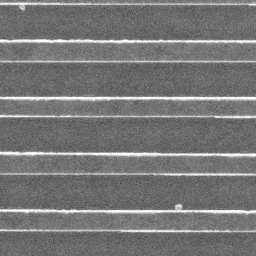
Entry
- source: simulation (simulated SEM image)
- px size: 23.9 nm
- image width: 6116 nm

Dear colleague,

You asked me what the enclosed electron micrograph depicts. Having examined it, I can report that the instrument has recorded lines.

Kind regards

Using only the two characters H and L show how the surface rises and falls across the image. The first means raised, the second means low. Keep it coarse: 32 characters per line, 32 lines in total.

LLLLLLLLLLLLLLLLLLLLLLLLLLLLLLLH
LLLLLLLLLLLLLLLLLLLLLLLLLLLLLLLL
LLLLLLLLLLLLLLLLLLLLLLLLLLLLLLLL
LLLLLLLLLLLLLLLLLLLLLLLLLLLLLLLL
LLLLLLLLLLLLLLLLLLLLLLLLLLLLLLLL
HHHHHHHHHHHHHHHHHHHHHHHHHHHHHHHH
HHHHHHHHHHHHHHHHHHHHHHHHHHHHHHHH
HHHHHHHHHHHHHHHHHHHHHHHHHHHHHHHH
LLLLLLLLLLLLLLLLLLLLLLLLLLLLLLLL
LLLLLLLLLLLLLLLLLLLLLLLLLLLLLLLL
LLLLLLLLLLLLLLLLLLLLLLLLLLLLLLLL
LLLLLLLLLLLLLLLLLLLLLLLLLLLLLLLL
HHHHHHHHHHHHHHHHHHHHHHHHHHHHHHHH
HHHHHHHHHHHHHHHHHHHHHHHHHHHHHHHH
HHHHHHHHHHHHHHHHHHHHHHHHHHHHHHHH
LLLLLLLLLLLLLLLLLLLLLLLLLLLLLLLL
LLLLLLLLLLLLLLLLLLLLLLLLLLLLLLLL
LLLLLLLLLLLLLLLLLLLLLLLLLLLLLLLL
LLLLLLLLLLLLLLLLLLLLLLLLLLLLLLLL
HHHHHHHHHHHHHHHHHHHHHHHHHHHHHHHH
HHHHHHHHHHHHHHHHHHHHHHHHHHHHHHHH
HHHHHHHHHHHHHHHHHHHHHHHHHHHHHHHH
LLLLLLLLLLLLLLLLLLLLLLLLLLLLLLLL
LLLLLLLLLLLLLLLLLLLLLLLLLLLLLLLL
LLLLLLLLLLLLLLLLLLLLLLLLLLLLLLLL
LLLLLLLLLLLLLLLLLLLLLLLLLLLLLLLL
HHHHHHHHHHHHHHHHHHHHHHHHHHHHHHHH
HHHHHHHHHHHHHHHHHHHHHHHHHHHHHHHH
HHHHHHHHHHHHHHHHHHHHHHHHHHHHHHHH
LLLLLLLLLLLLLLLLLLLLLLLLLLLLLLLL
LLLLLLLLLLLLLLLLLLLLLLLLLLLLLLLL
LLLLLLLLLLLLLLLLLLLLLLLLLLLLLLLL